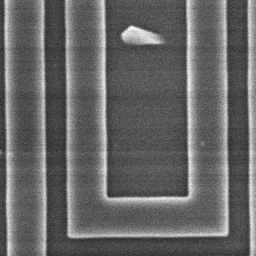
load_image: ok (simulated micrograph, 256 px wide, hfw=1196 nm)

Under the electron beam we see groups of lines, slits or small figures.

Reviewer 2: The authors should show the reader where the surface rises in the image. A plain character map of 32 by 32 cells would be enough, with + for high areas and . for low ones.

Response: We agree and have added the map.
.++++...+++++...........++++...+
.++++...+++++...........++++...+
.++++...+++++...........++++...+
.++++...+++++...+.......++++...+
.++++...+++++...+++.....++++...+
.++++...+++++...........++++...+
.++++...+++++...........++++...+
.++++...+++++...........++++...+
.++++...+++++...........++++...+
.++++...+++++...........++++...+
.++++...+++++...........++++...+
.++++...+++++...........++++...+
.++++...+++++...........++++...+
.++++...+++++...........++++...+
.++++...+++++...........++++...+
.++++...+++++...........++++...+
.++++...+++++...........++++...+
.++++...+++++...........++++...+
.+++++..+++++...........++++...+
.+++++..+++++...........++++...+
.+++++..+++++...........++++...+
.+++++...++++...........++++...+
.+++++...++++...........++++...+
.+++++...++++...........++++...+
.+++++...++++...........++++...+
.+++++...+++++++++++++++++++...+
.+++++...+++++++++++++++++++...+
.+++++...+++++++++++++++++++...+
.+++++...+++++++++++++++++++...+
.+++++...++++++.....++.........+
.+++++.........................+
.+++++.........................+